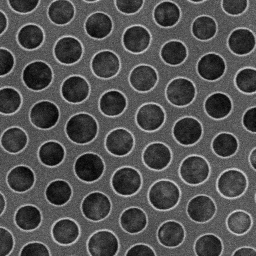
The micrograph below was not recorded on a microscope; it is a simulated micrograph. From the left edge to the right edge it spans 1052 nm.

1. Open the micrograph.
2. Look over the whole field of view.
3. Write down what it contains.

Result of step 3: a regular array of holes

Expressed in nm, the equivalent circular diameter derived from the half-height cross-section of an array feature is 114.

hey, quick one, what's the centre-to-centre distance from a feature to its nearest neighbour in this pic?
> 162 nm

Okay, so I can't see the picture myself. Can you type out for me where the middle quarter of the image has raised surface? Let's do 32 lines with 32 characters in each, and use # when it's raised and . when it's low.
#######.......####...###########
#######.......###......#########
########.....####......#########
#....####..#####.......######.##
......##########.......####.....
......###########......###......
......######.#####...#####......
......####.....##########.......
......###......###########......
#...#####.......##########......
#########.......###.....####..##
#########......####......#######
###...####....####.......#######
##......##########.......#####..
#.......##########.......###....
#.......###########.....####....
........####....####...####.....
#.......###......##########.....
#.......###......###########....
###...####.......###########....
##########.......####.....######
###########......###......######
#####...####....####.......#####
###......###########.......####.
###.......##########......####..
###.......###########.....###...
###.......###.....#####.#####...
###.......##.......##########...
####.....###.......##########...
.#####.#####.......####....###..
.###########.......###......####
..###########......##........###